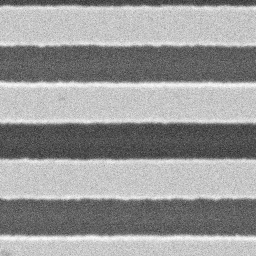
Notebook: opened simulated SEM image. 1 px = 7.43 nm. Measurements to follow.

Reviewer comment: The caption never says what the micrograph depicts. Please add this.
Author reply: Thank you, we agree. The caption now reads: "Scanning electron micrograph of lines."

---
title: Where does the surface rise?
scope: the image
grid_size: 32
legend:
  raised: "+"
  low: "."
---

................................
++++++++++++++++++++++++++++++++
++++++++++++++++++++++++++++++++
++++++++++++++++++++++++++++++++
++++++++++++++++++++++++++++++++
+++++++++++.++++++++++++++++++++
................................
................................
................................
................................
+...............................
++++++++++++++++++++++++++++++++
++++++++++++++++++++++++++++++++
++++++++++++++++++++++++++++++++
++++++++++++++++++++++++++++++++
................................
................................
................................
................................
................................
++++++++++++++++++++++++++++++++
++++++++++++++++++++++++++++++++
++++++++++++++++++++++++++++++++
++++++++++++++++++++++++++++++++
++++++++++++++++++++++++++++++++
................................
................................
................................
................................
................................
++++++++++++++++++++++++++++++++
++++++++++++++++++++++++++++++++